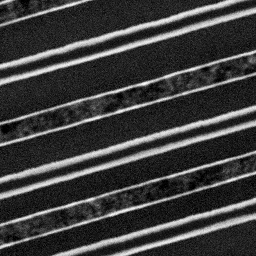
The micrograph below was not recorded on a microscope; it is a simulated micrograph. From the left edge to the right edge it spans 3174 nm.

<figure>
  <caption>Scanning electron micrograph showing lines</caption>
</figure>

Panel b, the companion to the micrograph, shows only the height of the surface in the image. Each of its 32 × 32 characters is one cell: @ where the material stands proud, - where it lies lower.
@@@@@@@@@-------------------@@@@
@@@@@@------------------@@@@@@@-
@@-------------------@@@@@@@----
-----------------@@@@@@@--------
--------------@@@@@@@-----------
----------@@@@@@@---------------
-------@@@@@@@------------------
---@@@@@@@@-----------------@@@@
@@@@@@@-----------------@@@@@@@@
@@@------------------@@@@@@@@@@-
------------------@@@@@@@@@@----
--------------@@@@@@@@@@--------
----------@@@@@@@@@@------------
-------@@@@@@@@@@---------------
---@@@@@@@@@@---------------@@@@
@@@@@@@@@@---------------@@@@@@@
@@@@@@---------------@@@@@@@----
@@----------------@@@@@@--------
---------------@@@@@@-----------
-----------@@@@@@-------------@@
--------@@@@@@-------------@@@@@
----@@@@@@@------------@@@@@@@@@
@@@@@@@------------@@@@@@@@@@---
@@@@------------@@@@@@@@@@------
-------------@@@@@@@@@----------
---------@@@@@@@@@@-----------@@
-----@@@@@@@@@@------------@@@@@
--@@@@@@@@@@-----------@@@@@@@--
@@@@@@@@@-----------@@@@@@@-----
@@@@@-----------@@@@@@@---------
@@-----------@@@@@@@------------
---------@@@@@@@@---------------